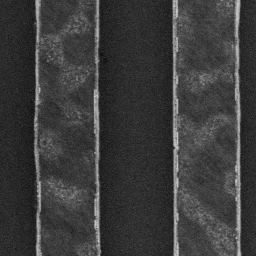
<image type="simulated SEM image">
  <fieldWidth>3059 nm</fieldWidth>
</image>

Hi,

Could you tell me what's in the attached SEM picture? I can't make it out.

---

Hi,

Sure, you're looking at one or a few lines or trenches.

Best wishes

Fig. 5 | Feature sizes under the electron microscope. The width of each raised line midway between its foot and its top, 747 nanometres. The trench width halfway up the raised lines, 919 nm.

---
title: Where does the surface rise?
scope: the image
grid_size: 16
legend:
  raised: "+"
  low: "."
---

..++++.....++++.
..++++.....++++.
..++++.....++++.
..++++.....++++.
..++++.....++++.
..++++.....++++.
..++++.....++++.
..++++.....++++.
..++++.....++++.
..++++.....++++.
..++++.....++++.
..++++.....++++.
..++++.....++++.
..++++.....++++.
..++++.....++++.
..++++.....++++.